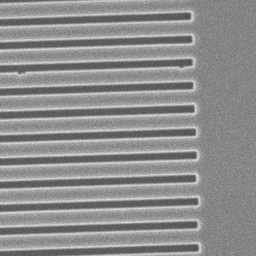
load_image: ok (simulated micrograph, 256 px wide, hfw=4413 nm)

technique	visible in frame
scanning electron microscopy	parallel lines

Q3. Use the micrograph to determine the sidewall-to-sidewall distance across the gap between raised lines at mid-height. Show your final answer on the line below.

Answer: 7.87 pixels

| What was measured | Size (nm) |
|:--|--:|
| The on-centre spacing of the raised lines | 400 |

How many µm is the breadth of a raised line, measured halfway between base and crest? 0.269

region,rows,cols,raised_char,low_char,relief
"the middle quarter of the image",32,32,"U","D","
DDDDDDDDDDDDDDDDDDDDDDDDDDDDDDDD
DDDDDDDDDDDUUUUUUUUUUUUUUUUUUUUU
UUUUUUUUUUUUUUUUUUUUUUUUUUUUUUUU
UUUUUUUUUUUUUUUUUUUUUUUUUUUUUUUU
UUUUUUUUUUUUUUUUUUUUUUUUDDDDDDDD
DDDDDDDDDDDDDDDDDDDDDDDDDDDDDDDD
DDDDDDDDDDDDDDDDDDDDDDDDDDDDDUUU
UUUUUUUUUUUUUUUUUUUUUUUUUUUUUUUU
UUUUUUUUUUUUUUUUUUUUUUUUUUUUUUUU
UUUUUUUUUUUUUUUUUUUUUUUUUUUUUUUU
UUUUUUUUUUUUUUUUUUUUDDDDDDDDDDDD
DDDDDDDDDDDDDDDDDDDDDDDDDDDDDDDD
DDDDDDDDDDDDDDDDDDDDDDDDDDDDDDDD
DDUUUUUUUUUUUUUUUUUUUUUUUUUUUUUU
UUUUUUUUUUUUUUUUUUUUUUUUUUUUUUUU
UUUUUUUUUUUUUUUUUUUUUUUUUUUUUUUU
UUUUUUUUUUUUUUUUDDDDDDDDDDDDDDDD
DDDDDDDDDDDDDDDDDDDDDDDDDDDDDDDD
DDDDDDDDDDDDDDDDDDDDDUUUUUUUUUUU
UUUUUUUUUUUUUUUUUUUUUUUUUUUUUUUU
UUUUUUUUUUUUUUUUUUUUUUUUUUUUUUUU
UUUUUUUUUUUUUUUUUUUUUUUUUUUUUUUU
UUUUUUUUUUUUDDDDDDDDDDDDDDDDDDDD
DDDDDDDDDDDDDDDDDDDDDDDDDDDDDDDD
DDDDDDDDDDDDDDDDDUUUUUUUUUUUUUUU
UUUUUUUUUUUUUUUUUUUUUUUUUUUUUUUU
UUUUUUUUUUUUUUUUUUUUUUUUUUUUUUUU
UUUUUUUUUUUUUUUUUUUUUUUUUUUUUUUD
UUDDDDDDDDDDDDDDDDDDDDDDDDDDDDDD
DDDDDDDDDDDDDDDDDDDDDDDDDDDDDDDD
DDDDDDDDDDDDUUUUUUUUUUUUUUUUUUUU
UUUUUUUUUUUUUUUUUUUUUUUUUUUUUUUU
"